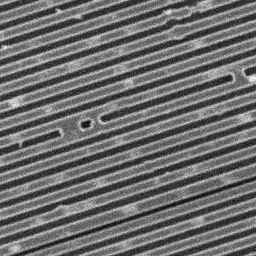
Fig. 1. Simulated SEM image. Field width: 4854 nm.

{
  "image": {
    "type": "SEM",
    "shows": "parallel lines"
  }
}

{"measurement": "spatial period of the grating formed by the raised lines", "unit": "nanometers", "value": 323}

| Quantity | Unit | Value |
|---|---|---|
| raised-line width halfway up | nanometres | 180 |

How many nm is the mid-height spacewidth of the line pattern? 149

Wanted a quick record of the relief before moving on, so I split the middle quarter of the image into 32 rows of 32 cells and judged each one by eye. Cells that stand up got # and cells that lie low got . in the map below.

######.......#######......######
###.......#######......########.
......########......########....
...#######.......########......#
#######.......#######.......####
####.......#######.......#######
#.......#######.......#######...
....########.......#######......
.########......########......###
######......#######........#####
###......#######.......########.
......#######.......#######.....
...#######.......#######.......#
#########.....#######.......####
####...##..#######.......#######
####...########......#######....
############......#######.......
#########......#######.......###
######......########......######
###......#######.......#######..
......#######.......#######.....
...#######.......#######......##
#######......########......#####
####......########......########
#......########......#######....
....########......########......
.########......#######......####
######......#######......#######
##.......########.....########..
......#######......########.....
...#######......########.......#
#######......########.......####